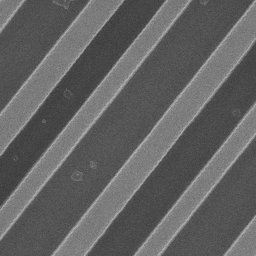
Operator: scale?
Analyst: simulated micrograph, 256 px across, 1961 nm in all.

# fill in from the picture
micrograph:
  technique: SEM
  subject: lines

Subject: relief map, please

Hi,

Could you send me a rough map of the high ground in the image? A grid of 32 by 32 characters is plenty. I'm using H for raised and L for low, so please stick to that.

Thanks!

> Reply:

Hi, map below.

HHHLLLLLLLLHHHHLLLLLHHHLLLLLLLLL
HHLLLLLLLLHHHHLLLLLLHHHLLLLLLLLH
HLLLLLLLLLHHHLLLLLLHHHLLLLLLLLHH
LLLLLLLLLHHHHLLLLLHHHLLLLLLLLHHH
LLLLLLLLHHHHLLLLLHHHLLLLLLLLHHHH
LLLLLLLHHHHLLLLLLHHLLLLLLLLLHHHL
LLLLLLHHHHLLLLLLHHHLLLLLLLLHHHHL
LLLLLHHHHLLLLLLHHHLLLLLLLLHHHHLL
LLLLLHHHHLLLLLHHHLLLLLLLLHHHHLLL
LLLLHHHHLLLLLHHHLLLLLLLLHHHHLLLL
LLLHHHHLLLLLLHHLLLLLLLLLHHHHLLLL
LLHHHHLLLLLLHHHLLLLLLLLHHHHLLLLL
LLHHHHLLLLLHHHLLLLLLLLHHHHLLLLLL
LHHHHLLLLLHHHLLLLLLLLHHHHLLLLLLL
HHHHLLLLLHHHLLLLLLLLHHHHLLLLLLLH
HHHLLLLLLHHLLLLLLLLLHHHHLLLLLLHH
HHLLLLLLHHHLLLLLLLLHHHHLLLLLLHHH
HHLLLLLHHHLLLLLLLLHHHHLLLLLLHHHL
HLLLLLHHHLLLLLLLLHHHHLLLLLLLHHHL
LLLLLHHHLLLLLLLLLHHHHLLLLLLHHHLL
LLLLLHHHLLLLLLLLHHHHLLLLLLHHHLLL
LLLLHHHLLLLLLLLHHHHLLLLLLHHHLLLL
LLLHHHLLLLLLLLHHHHLLLLLLHHHLLLLL
LLHHHLLLLLLLLHHHHLLLLLLLHHHLLLLL
LHHHLLLLLLLLLHHHHLLLLLLHHHLLLLLL
LHHLLLLLLLLLHHHHLLLLLLHHHLLLLLLL
HHHLLLLLLLLHHHHLLLLLLHHHLLLLLLLL
HHLLLLLLLLHHHHLLLLLLHHHLLLLLLLLL
HLLLLLLLLHHHHLLLLLLLHHHLLLLLLLLH
LLLLLLLLLHHHHLLLLLLHHHLLLLLLLLHH
LLLLLLLLHHHHLLLLLLHHHLLLLLLLLHHH
LLLLLLLHHHHLLLLLLHHHLLLLLLLLHHHH